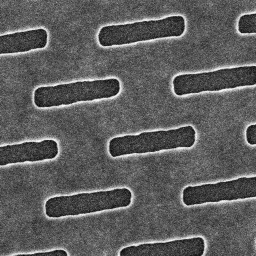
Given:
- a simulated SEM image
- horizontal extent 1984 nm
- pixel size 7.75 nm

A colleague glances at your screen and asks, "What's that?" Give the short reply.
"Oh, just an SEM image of holes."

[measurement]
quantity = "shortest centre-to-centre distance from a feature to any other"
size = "0.695 microns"